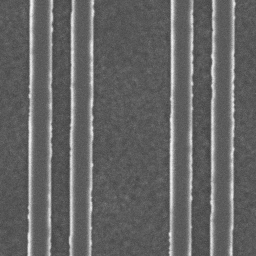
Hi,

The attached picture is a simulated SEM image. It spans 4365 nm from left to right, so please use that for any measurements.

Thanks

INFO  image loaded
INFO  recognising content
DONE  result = lines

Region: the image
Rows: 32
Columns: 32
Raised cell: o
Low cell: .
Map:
....ooo..ooo.........ooo...oo...
....ooo..ooo.........ooo...oo...
....ooo..ooo.........ooo...oo...
....ooo..ooo.........ooo...oo...
....oo...ooo.........ooo...oo...
....oo...ooo.........ooo...oo...
....oo...ooo.........ooo...oo...
....oo...ooo.........ooo...oo...
....oo...ooo.........ooo...oo...
....oo...ooo.........ooo...oo...
....oo...ooo.........ooo...oo...
....oo...ooo.........ooo...oo...
....oo...ooo.........ooo...oo...
....oo...ooo.........ooo...oo...
....oo...ooo.........ooo...oo...
....oo...oo..........ooo...oo...
....oo...ooo.........ooo...oo...
....oo...ooo.........ooo...oo...
....oo...oo..........ooo...oo...
....oo...oo..........ooo...oo...
....oo...oo..........ooo...oo...
....oo...oo..........ooo...oo...
....oo...oo..........ooo...oo...
....oo...oo..........ooo...oo...
....oo...oo..........ooo...oo...
....oo...oo..........ooo..ooo...
....oo...oo..........ooo...oo...
....oo...oo..........ooo..ooo...
....oo...oo..........ooo..ooo...
....oo...oo..........ooo..ooo...
....oo...oo..........ooo..ooo...
....oo...oo..........ooo..ooo...